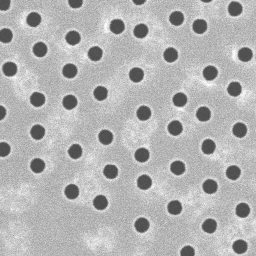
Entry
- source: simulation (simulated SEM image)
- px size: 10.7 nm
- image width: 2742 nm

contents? a regular array of holes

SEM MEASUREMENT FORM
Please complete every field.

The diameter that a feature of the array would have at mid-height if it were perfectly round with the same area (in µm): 0.167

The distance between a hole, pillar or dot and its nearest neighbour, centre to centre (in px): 31.6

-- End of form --